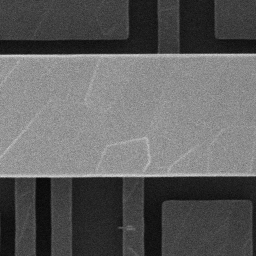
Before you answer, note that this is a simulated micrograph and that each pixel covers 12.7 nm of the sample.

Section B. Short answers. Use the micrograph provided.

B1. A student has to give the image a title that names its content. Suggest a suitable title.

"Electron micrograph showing wiring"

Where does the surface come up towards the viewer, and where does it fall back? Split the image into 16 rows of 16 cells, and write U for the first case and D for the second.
DDDDDDDDDDDDDDDD
DDDDDDDDDDDDDDDD
DDDDDDDDDDDDDDDD
UUUUUUUUUUUUUUUU
UUUUUUUUUUUUUUUU
UUUUUUUUUUUUUUUU
UUUUUUUUUUUUUUUU
UUUUUUUUUUUUUUUU
UUUUUUUUUUUUUUUU
UUUUUUUUUUUUUUUU
UUUUUUUUUUUUUUUU
DDDDDDDDDDDDDDDD
DDDDDDDDDDDDDDDD
DDDDDDDDDDDDDDDD
DDDDDDDDDDDDDDDD
DDDDDDDDDDDDDDDD